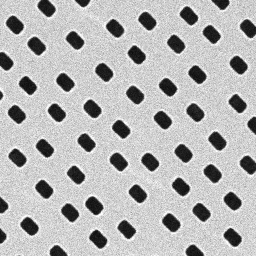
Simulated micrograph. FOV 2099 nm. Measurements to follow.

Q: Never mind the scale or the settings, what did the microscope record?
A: a regular array of holes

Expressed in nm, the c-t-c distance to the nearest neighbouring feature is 268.